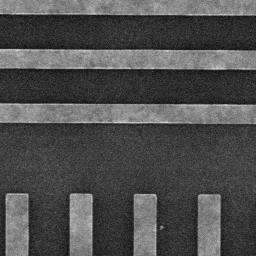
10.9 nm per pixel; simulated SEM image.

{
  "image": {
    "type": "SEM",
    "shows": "groups of lines, slits or small figures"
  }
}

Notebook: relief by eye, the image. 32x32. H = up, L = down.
HHHHHHHHHHHHHHHHHHHHHHHHHHHHHHHH
HHHHHHHHHHHHHHHHHHHHHHHHHHHHHHHH
LLLLLLLLLLLLLLLLLLLLLLLLLLLLLLLL
LLLLLLLLLLLLLLLLLLLLLLLLLLLLLLLL
LLLLLLLLLLLLLLLLLLLLLLLLLLLLLLLL
LLLLLLLLLLLLLLLLLLLLLLLLLLLLLLLL
HHHHHHHHHHHHHHHHHHHHHHHHHHHHHHHH
HHHHHHHHHHHHHHHHHHHHHHHHHHHHHHHH
LLLLHHHHHHHHHHHHHHHHHHHHHHHHHHHH
LLLLLLLLLLLLLLLLLLLLLLLLLLLLLLLL
LLLLLLLLLLLLLLLLLLLLLLLLLLLLLLLL
LLLLLLLLLLLLLLLLLLLLLLLLLLLLLLLL
LLLLLLLLLLLLLLLLLLLLLLLLLLLLLLLL
HHHHHHHHHHHHHHHHHHHHHHHHHHHHHHHH
HHHHHHHHHHHHHHHHHHHHHHHHHHHHHHHH
LLLLLLLLLLLLLLLLLLLLLLLLLLLLLLLL
LLLLLLLLLLLLLLLLLLLLLLLLLLLLLLLL
LLLLLLLLLLLLLLLLLLLLLLLLLLLLLLLL
LLLLLLLLLLLLLLLLLLLLLLLLLLLLLLLL
LLLLLLLLLLLLLLLLLLLLLLLLLLLLLLLL
LLLLLLLLLLLLLLLLLLLLLLLLLLLLLLLL
LLLLLLLLLLLLLLLLLLLLLLLLLLLLLLLL
LLLLLLLLLLLLLLLLLLLLLLLLLLLLLLLL
LLLLLLLLLLLLLLLLLLLLLLLLLLLLLLLL
LHHLLLLLLHHLLLLLLHHLLLLLLHHLLLLL
LHHLLLLLLHHLLLLLLHHHLLLLLHHLLLLL
LHHLLLLLLHHLLLLLLHHHLLLLLHHLLLLL
LHHLLLLLLHHLLLLLLHHHLLLLLHHLLLLL
LHHLLLLLLHHLLLLLLHHHLLLLLHHLLLLL
LHHLLLLLLHHLLLLLLHHLLLLLLHHLLLLL
LHHLLLLLLHHLLLLLLHHLLLLLLHHLLLLL
LHHLLLLLLHHLLLLLLHHLLLLLLHHLLLLL